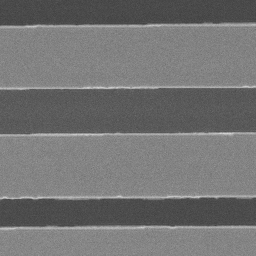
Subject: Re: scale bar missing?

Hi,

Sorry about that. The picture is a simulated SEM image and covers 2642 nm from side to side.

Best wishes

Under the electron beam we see lines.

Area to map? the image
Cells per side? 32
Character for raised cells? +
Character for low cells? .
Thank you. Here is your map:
................................
................................
................................
++++++++++++++++++++++++++++++++
++++++++++++++++++++++++++++++++
++++++++++++++++++++++++++++++++
++++++++++++++++++++++++++++++++
++++++++++++++++++++++++++++++++
++++++++++++++++++++++++++++++++
++++++++++++++++++++++++++++++++
++++++++++++++++++++++++++++++++
................................
................................
................................
................................
................................
................................
++++++++++++++++++++++++++++++++
++++++++++++++++++++++++++++++++
++++++++++++++++++++++++++++++++
++++++++++++++++++++++++++++++++
++++++++++++++++++++++++++++++++
++++++++++++++++++++++++++++++++
++++++++++++++++++++++++++++++++
++++++++++++++++++++++++++++++++
................................
................................
................................
...........+.+++++++++++++++++++
++++++++++++++++++++++++++++++++
++++++++++++++++++++++++++++++++
++++++++++++++++++++++++++++++++